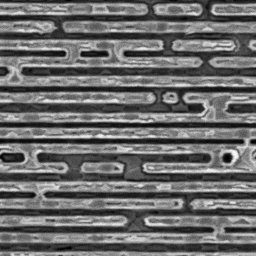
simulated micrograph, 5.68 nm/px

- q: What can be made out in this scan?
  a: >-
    parallel lines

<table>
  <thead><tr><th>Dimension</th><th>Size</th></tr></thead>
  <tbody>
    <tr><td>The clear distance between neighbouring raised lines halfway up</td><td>39.8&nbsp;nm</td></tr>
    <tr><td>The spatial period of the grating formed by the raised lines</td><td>99.9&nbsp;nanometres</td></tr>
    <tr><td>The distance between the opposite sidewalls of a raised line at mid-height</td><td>10.1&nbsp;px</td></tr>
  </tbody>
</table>